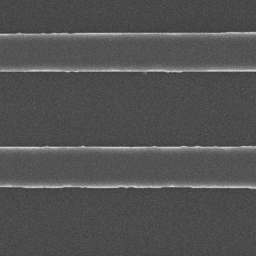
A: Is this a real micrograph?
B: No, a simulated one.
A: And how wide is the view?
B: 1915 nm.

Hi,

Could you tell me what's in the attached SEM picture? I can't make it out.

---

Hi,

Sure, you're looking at lines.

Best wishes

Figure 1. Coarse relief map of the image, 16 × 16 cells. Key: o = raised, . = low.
................
................
oooooooooooooooo
oooooooooooooooo
................
................
................
................
................
oooooooooooooooo
oooooooooooooooo
oooooooooooooooo
................
................
................
................